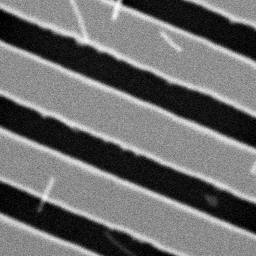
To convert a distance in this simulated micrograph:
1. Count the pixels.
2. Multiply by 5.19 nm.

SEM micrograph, lines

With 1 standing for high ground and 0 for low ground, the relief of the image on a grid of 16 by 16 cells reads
1111111100000111
0011111111000001
0000011111111000
1100000111111110
1111100001111111
1111111000001111
0111111110000011
0000111111110000
1000001111111100
1111000011111111
1111110000011111
0111111100000111
0001111111100001
0000011111111000
1110000011111111
1111100000111111